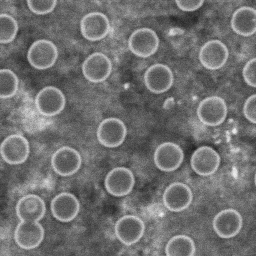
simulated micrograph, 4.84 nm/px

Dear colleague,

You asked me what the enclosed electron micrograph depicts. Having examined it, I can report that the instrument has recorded a regular array of raised bodies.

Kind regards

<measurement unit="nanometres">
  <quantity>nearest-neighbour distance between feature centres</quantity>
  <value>222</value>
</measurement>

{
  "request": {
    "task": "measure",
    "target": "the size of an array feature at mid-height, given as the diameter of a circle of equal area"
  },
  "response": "137 nanometers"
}